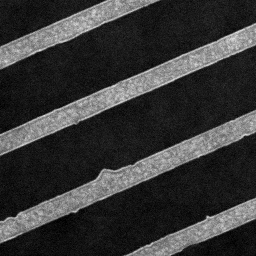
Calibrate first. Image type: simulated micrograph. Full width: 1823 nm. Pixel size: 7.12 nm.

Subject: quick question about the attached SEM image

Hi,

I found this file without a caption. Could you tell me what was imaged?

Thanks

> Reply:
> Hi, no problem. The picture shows one or a few lines or trenches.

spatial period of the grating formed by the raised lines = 569 nm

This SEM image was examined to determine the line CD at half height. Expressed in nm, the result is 135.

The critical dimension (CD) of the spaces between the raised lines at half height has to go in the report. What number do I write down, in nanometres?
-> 431